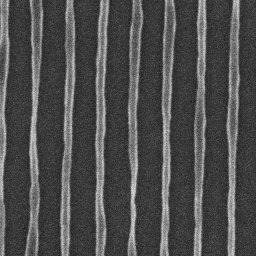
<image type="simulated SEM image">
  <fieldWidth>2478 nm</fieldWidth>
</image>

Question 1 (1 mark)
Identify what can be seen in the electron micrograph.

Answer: parallel lines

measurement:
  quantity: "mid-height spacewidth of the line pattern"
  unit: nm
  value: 247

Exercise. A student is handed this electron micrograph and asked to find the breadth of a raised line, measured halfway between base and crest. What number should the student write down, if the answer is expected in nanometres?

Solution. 70.2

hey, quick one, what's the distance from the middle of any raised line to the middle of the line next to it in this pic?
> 320 nm